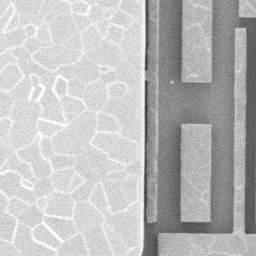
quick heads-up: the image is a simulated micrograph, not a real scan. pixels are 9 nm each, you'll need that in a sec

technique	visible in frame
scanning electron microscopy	wiring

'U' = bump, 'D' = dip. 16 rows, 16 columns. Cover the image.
UUUUUUUUUDDDDDDD
UUUUUUUUUDDDDDDD
UUUUUUUUUDDDDDDD
UUUUUUUUUDDDDDDD
UUUUUUUUUDDDDDDD
UUUUUUUUUDDDDDDD
UUUUUUUUUDDDDDDD
UUUUUUUUUDDDDDDD
UUUUUUUUUDDDDDDD
UUUUUUUUUDDDDDDD
UUUUUUUUUDDDDDDD
UUUUUUUUUDDDDDDD
UUUUUUUUUDDDDDDD
UUUUUUUUUDDDDDDD
UUUUUUUUUDDDDDDD
UUUUUUUUUDDDDDDD